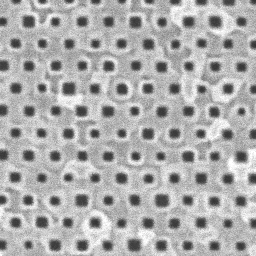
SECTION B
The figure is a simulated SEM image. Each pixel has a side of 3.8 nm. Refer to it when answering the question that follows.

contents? a regular array of holes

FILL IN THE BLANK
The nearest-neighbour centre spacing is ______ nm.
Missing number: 96.7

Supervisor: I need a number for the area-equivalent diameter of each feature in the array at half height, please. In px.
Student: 10.6